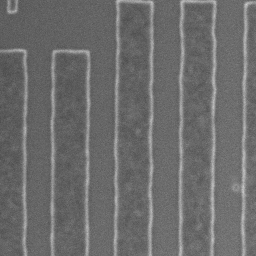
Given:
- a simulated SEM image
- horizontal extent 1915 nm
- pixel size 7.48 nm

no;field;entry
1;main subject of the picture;wiring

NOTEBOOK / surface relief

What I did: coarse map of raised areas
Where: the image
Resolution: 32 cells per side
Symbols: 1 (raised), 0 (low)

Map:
01000000000000011110000111100001
01000000000000011110000111100001
00000000000000011110000111100001
00000000000000011110000111100001
00000000000000011110000111100001
00000000000000011110000111100001
11100001111000011110000111100001
11100001111000011110000111100001
11100001111000011110000111100001
11100001111000011110001111100011
11100001111000111110001111100011
11100011111000111110000111100011
11100011111000111110000111100011
11100001111000111110000111100011
11100011111000111110000111100011
11100011111000111110000111100011
11100011111000111110001111100011
11100011111000111110001111100011
11100001111000111110001111100011
11100011111000111110000111100011
11100011111000111110000111100011
11100011111000111110001111100011
11100011111000111110001111100011
11100011111000111110001111100011
11100011111000111110001111100011
11100011111000111110001111100011
11100011111000111110001111100011
11100011111000111110001111100011
11100011111000111110001111100011
11100011111000111110001111100011
11100011111000111110001111100011
11100011111000111110001111100011